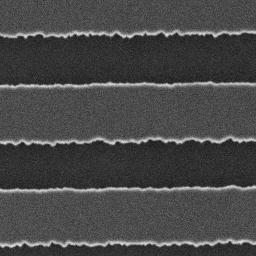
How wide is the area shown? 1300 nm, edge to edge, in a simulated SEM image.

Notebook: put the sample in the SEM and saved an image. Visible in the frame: lines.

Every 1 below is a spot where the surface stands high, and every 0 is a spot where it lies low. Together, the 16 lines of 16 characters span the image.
1111111111111111
1111111111111111
0000000000000000
0000000000000000
0000000000000000
1111111111111111
1111111111111111
1111111111111111
1111111111111111
0000000000000000
0000000000000000
0000000000000000
1111111111111111
1111111111111111
1111111111111111
0000000000000000